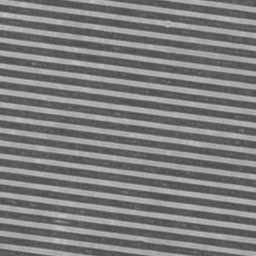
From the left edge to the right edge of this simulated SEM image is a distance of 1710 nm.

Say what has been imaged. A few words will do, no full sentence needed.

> parallel lines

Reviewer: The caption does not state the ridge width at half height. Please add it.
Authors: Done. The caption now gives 0.0323 µm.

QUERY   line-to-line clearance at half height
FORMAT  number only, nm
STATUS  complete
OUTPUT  52.1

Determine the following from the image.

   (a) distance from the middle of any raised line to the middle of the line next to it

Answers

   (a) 85.2 nm